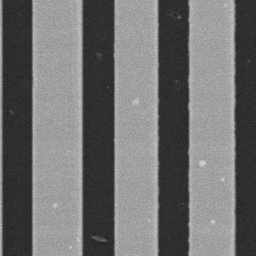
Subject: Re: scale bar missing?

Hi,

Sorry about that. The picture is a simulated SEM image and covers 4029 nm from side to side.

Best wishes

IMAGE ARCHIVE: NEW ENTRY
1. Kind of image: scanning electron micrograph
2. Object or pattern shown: lines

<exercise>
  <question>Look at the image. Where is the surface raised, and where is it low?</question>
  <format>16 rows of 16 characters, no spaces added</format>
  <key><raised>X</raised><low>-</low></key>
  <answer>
--XXX--XXX--XXX-
--XXX--XXX--XXX-
--XXX--XXX--XXX-
--XXX--XXX--XXX-
--XXX--XXX--XXX-
--XXX--XXX--XXX-
--XXX--XXX--XXX-
--XXX--XXX--XXX-
--XXX--XXX--XXX-
--XXX--XXX--XXX-
--XXX--XXX--XXX-
--XXX--XXX--XXX-
--XXX--XXX--XXX-
--XXX--XXX--XXX-
--XXX--XXX--XXX-
--XXX--XXX--XXX-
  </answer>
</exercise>